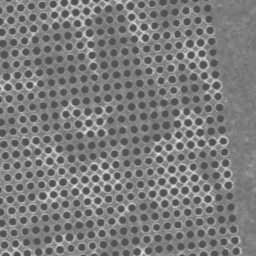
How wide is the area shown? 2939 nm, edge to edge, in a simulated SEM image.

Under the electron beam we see a regular array of holes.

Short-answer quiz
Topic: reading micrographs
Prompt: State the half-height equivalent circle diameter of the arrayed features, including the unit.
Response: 89.7 nm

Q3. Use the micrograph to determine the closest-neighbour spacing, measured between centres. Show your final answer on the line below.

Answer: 0.123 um